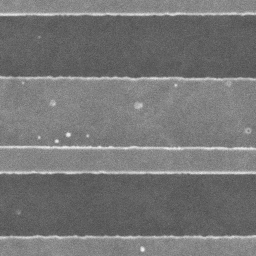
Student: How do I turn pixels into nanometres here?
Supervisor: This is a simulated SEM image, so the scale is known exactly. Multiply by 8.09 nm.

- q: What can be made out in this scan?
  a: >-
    lines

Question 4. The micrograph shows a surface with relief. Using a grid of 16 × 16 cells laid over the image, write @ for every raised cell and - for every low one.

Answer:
@@@@@@@@@@@@@@@@
----------------
----------------
----------------
----------------
@@@@@@@@@@@@@@@@
@@@@@@@@@@@@@@@@
@@@@@@@@@@@@@@@@
@@@@@@@@@@@@@@@@
@@@@@@@@@@@@@@@@
@@@@@@@@@@@@@@@@
----------------
----------------
----------------
----------------
@@@@@@@@@@@@@@@@